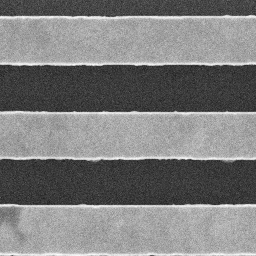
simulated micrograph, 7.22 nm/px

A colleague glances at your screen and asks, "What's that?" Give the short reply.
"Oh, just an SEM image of lines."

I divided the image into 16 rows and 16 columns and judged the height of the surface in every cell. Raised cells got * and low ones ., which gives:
................
****************
****************
****************
................
................
................
****************
****************
****************
................
................
................
****************
****************
****************